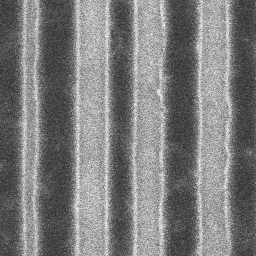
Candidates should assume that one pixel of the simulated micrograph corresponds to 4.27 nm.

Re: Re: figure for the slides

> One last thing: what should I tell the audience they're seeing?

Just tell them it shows one or a few lines or trenches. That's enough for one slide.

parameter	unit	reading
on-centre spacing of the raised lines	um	0.265